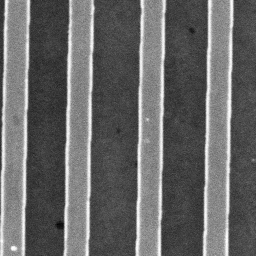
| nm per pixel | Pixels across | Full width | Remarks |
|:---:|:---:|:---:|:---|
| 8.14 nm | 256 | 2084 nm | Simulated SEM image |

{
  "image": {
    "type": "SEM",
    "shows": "lines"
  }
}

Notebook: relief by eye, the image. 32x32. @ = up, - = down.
-@@@-----@@@------@@@-----@@@---
-@@@-----@@@------@@@-----@@@---
-@@@-----@@@------@@------@@@---
-@@@-----@@@------@@------@@@---
-@@@-----@@@------@@------@@@---
-@@@-----@@@------@@------@@@---
-@@@-----@@-------@@------@@@---
-@@@-----@@-------@@------@@@---
-@@@-----@@-------@@------@@@---
@@@------@@-------@@------@@@---
@@@------@@------@@@------@@@---
@@@------@@------@@@------@@@---
@@@------@@------@@@------@@@---
@@@-----@@@------@@@------@@@---
@@@-----@@@------@@@------@@@---
@@@-----@@@------@@@------@@@---
@@@-----@@@------@@@------@@@---
@@@-----@@@------@@@------@@@---
@@@-----@@@------@@@------@@@---
@@@-----@@@------@@@------@@@---
@@@-----@@@------@@@------@@@---
@@@-----@@@------@@@------@@@---
@@@-----@@@------@@@------@@@---
@@@-----@@@------@@@------@@@---
@@@-----@@@------@@@------@@@---
@@@-----@@@------@@@------@@@---
@@@-----@@@------@@@------@@@---
@@@-----@@@------@@@------@@----
@@@-----@@@------@@@------@@----
@@@-----@@@------@@@-----@@@----
@@@-----@@@------@@@-----@@@----
@@@-----@@@------@@@-----@@@----